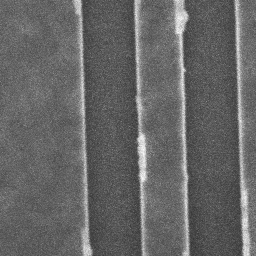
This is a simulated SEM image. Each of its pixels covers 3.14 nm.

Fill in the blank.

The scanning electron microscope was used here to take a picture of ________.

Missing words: one or a few lines or trenches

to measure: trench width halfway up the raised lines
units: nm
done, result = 172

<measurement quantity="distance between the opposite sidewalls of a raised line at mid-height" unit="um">0.141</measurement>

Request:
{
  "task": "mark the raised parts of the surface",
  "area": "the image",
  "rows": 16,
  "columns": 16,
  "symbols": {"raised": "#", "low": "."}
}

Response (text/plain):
#####...####...#
#####....###...#
#####....##....#
#####....##....#
#####....##....#
#####....##....#
#####....##....#
#####....##....#
#####....##....#
#####....###...#
#####....###...#
#####....###...#
#####....###...#
#####....###...#
######...###...#
######...###...#